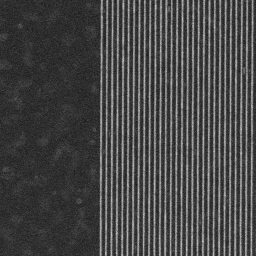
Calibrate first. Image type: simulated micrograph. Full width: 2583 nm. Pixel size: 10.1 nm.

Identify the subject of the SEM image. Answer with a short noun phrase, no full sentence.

parallel lines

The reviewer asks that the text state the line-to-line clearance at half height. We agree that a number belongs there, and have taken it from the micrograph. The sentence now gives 0.0391 µm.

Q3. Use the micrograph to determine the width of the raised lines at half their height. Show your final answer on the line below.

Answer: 15.1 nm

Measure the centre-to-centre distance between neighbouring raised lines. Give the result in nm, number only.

54.3